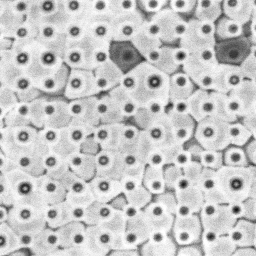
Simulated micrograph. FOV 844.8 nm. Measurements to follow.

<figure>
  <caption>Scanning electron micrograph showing a regular array of holes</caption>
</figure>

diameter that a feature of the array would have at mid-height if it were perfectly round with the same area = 33.5 nm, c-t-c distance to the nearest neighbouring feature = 84.4 nm